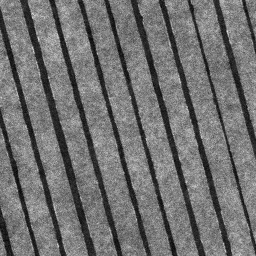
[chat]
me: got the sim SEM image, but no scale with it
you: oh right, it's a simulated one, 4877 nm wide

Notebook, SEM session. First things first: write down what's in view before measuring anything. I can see parallel lines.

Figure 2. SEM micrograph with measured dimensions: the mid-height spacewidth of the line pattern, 113 nanometres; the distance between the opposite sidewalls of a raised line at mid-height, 386 nanometres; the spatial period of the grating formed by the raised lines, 0.507 µm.